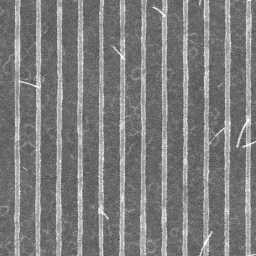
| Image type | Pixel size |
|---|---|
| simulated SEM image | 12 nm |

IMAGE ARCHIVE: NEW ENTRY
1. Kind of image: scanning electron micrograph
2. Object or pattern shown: parallel lines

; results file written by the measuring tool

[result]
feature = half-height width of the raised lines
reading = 47.9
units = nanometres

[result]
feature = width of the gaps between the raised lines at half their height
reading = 204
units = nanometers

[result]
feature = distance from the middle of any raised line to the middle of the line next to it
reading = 252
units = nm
